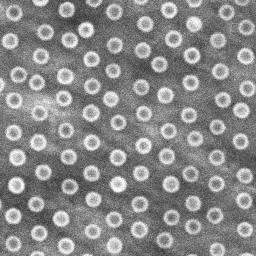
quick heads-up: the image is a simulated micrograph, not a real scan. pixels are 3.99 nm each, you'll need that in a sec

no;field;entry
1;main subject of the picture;a regular array of raised bodies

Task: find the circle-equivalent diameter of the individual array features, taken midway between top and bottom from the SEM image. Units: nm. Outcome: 57.2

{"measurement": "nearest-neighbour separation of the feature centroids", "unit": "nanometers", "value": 101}